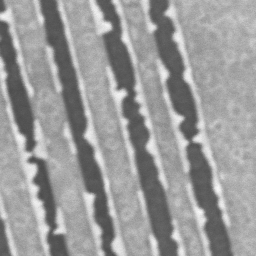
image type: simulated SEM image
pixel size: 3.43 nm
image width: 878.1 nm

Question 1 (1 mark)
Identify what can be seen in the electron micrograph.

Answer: parallel lines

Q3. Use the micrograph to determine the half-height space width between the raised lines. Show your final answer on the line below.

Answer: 62.7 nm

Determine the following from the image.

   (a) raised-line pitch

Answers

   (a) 182 nm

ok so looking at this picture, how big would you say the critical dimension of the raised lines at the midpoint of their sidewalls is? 122 nm